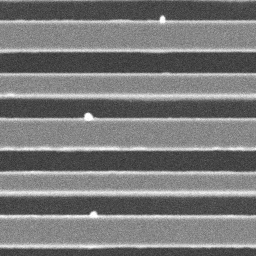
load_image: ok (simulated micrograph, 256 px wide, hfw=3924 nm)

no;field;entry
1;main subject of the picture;lines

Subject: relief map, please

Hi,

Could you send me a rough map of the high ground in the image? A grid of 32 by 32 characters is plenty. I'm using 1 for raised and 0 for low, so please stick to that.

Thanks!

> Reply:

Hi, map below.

00000000000000000000000000000000
00000000000000000000000000000000
00000000000000000000100000000000
11111111111111111111111111111111
11111111111111111111111111111111
11111111111111111111111111111111
00000000000000000000000000000000
00000000000000000000000000000000
00000000000000000000000000000000
11111111111111111111111111111111
11111111111111111111111111111111
11111111111111111111111111111111
00000000000000000000000000000000
00000000000000000000000000000000
00000000000100000000000000000000
11111111111111111111111111111111
11111111111111111111111111111111
11111111111111111111111111111111
11111111111111111111111111111111
00000000000000000000000000000000
00000000000000000000000000000000
00111100001111111000000100000000
11111111111111111111111111111111
11111111111111111111111111111111
00000000000000000000000000000000
00000000000000000000000000000000
00000000000000000000000000000000
11111111111111111111111111111111
11111111111111111111111111111111
11111111111111111111111111111111
11111111111111111111111111111111
00000000000000000000000000000000